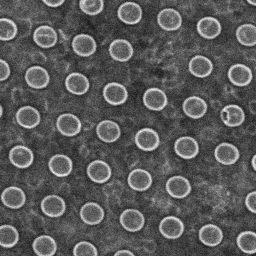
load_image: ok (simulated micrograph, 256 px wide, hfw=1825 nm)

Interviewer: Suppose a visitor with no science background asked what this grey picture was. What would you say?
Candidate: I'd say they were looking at a regular array of raised bodies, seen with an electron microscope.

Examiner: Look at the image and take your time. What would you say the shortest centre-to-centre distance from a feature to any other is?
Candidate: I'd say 283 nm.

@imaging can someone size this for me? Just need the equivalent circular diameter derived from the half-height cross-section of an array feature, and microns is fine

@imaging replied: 0.159